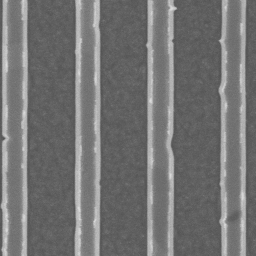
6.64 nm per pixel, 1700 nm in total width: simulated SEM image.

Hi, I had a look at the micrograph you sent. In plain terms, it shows one or a few lines or trenches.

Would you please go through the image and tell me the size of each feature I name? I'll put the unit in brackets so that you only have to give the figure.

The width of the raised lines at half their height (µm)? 0.144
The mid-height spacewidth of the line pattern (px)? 50.5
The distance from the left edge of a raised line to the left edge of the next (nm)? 484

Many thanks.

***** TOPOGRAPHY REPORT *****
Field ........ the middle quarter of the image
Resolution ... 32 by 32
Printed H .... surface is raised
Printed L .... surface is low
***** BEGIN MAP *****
LLLHHHHHHLLLLLLLLLLLLHHHHHHLLLLL
LLLHHHHHHLLLLLLLLLLLLHHHHHHLLLLL
LLLHHHHHHLLLLLLLLLLLLHHHHHHLLLLL
LLLHHHHHHLLLLLLLLLLLLHHHHHHLLLLL
LLLHHHHHHLLLLLLLLLLLLHHHHHHLLLLL
LLLHHHHHHLLLLLLLLLLLLHHHHHHLLLLL
LLLHHHHHHLLLLLLLLLLLLHHHHHHLLLLL
LLLHHHHHHLLLLLLLLLLLLHHHHHHLLLLL
LLLHHHHHHLLLLLLLLLLLLHHHHHHLLLLL
LLLHHHHHHLLLLLLLLLLLLHHHHHHLLLLL
LLLHHHHHHLLLLLLLLLLLLHHHHHHLLLLL
LLLLHHHHHLLLLLLLLLLLLHHHHHHLLLLL
LLLLHHHHHLLLLLLLLLLLLHHHHHHLLLLL
LLLLHHHHHLLLLLLLLLLLLHHHHHHLLLLL
LLLLHHHHHLLLLLLLLLLLLHHHHHHLLLLL
LLLLHHHHHLLLLLLLLLLLLHHHHHHLLLLL
LLLLHHHHHLLLLLLLLLLLLHHHHHHLLLLL
LLLLHHHHHLLLLLLLLLLLLHHHHHHLLLLL
LLLLHHHHHLLLLLLLLLLLLHHHHHHLLLLL
LLLHHHHHHLLLLLLLLLLLLHHHHHLLLLLL
LLLHHHHHLLLLLLLLLLLLLHHHHHLLLLLL
LLLHHHHHLLLLLLLLLLLLLHHHHHHLLLLL
LLLHHHHHLLLLLLLLLLLLLHHHHHHLLLLL
LLLHHHHHLLLLLLLLLLLLLHHHHHHLLLLL
LLLHHHHHLLLLLLLLLLLLLHHHHHHLLLLL
LLLHHHHHLLLLLLLLLLLLLHHHHHHLLLLL
LLLHHHHHLLLLLLLLLLLLLHHHHHHLLLLL
LLLHHHHHLLLLLLLLLLLLLHHHHHHLLLLL
LLLHHHHHLLLLLLLLLLLLLHHHHHHLLLLL
LLLHHHHHLLLLLLLLLLLLLHHHHHHLLLLL
LLLHHHHHLLLLLLLLLLLLLHHHHHHLLLLL
LLLHHHHHLLLLLLLLLLLLLHHHHHHLLLLL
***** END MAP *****